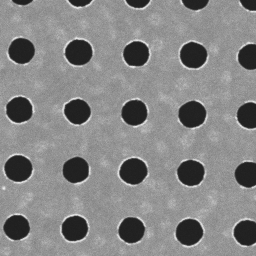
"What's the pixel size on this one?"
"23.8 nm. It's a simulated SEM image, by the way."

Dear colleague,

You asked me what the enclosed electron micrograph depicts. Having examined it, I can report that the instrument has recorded a regular array of holes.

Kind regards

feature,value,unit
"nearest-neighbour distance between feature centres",1360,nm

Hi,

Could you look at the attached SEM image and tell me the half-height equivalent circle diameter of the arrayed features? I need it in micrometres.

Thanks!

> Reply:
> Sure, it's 0.636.